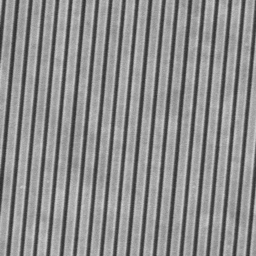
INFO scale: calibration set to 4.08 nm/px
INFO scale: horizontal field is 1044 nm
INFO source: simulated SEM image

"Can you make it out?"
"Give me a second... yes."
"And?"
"parallel lines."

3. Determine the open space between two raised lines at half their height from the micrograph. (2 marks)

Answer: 21.3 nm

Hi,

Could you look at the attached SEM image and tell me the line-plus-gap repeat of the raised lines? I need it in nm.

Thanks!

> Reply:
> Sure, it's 54.1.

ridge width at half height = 32 nm